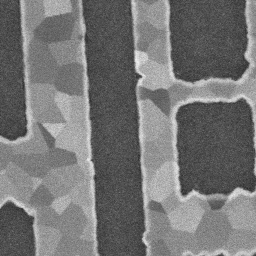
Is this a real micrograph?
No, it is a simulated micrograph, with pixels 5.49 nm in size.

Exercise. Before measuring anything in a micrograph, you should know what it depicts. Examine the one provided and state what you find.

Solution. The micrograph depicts one or a few lines or trenches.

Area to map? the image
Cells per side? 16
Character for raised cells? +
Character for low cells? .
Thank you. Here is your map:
.++++...++.....+
.++++...++......
..+++...+++.....
..+++...+++.....
..+++....++....+
..+++....+++++++
..++++...++.....
..++++...++.....
..++++...++.....
++++++...++.....
++++++...++.....
++++++...++.....
++++++...+++++++
..++++...+++++++
..++++...+++++++
..++++...+++++++